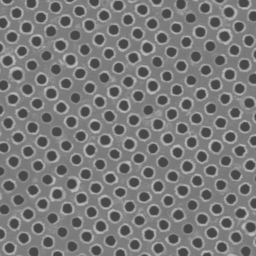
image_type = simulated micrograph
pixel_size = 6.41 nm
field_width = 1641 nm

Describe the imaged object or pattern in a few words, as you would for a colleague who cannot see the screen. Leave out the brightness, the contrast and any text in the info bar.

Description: a regular array of holes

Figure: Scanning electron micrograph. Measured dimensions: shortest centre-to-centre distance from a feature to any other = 17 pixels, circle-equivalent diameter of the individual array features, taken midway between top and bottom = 0.0596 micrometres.